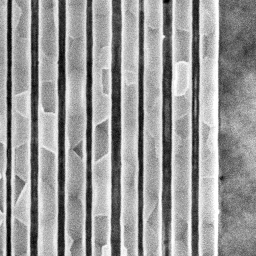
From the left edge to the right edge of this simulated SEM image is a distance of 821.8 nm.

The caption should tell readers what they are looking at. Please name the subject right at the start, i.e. parallel lines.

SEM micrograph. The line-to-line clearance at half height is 24.5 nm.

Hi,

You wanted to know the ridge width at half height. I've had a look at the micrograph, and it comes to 0.0609 micrometres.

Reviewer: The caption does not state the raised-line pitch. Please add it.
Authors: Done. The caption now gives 85.9 nanometres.